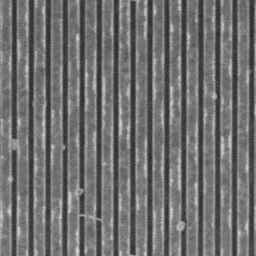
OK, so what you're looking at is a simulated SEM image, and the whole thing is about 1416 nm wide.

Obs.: parallel lines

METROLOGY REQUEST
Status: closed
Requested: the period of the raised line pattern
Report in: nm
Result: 93.8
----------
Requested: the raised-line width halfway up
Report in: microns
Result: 0.0581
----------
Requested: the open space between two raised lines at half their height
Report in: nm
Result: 36